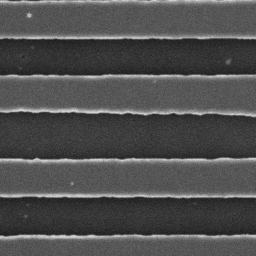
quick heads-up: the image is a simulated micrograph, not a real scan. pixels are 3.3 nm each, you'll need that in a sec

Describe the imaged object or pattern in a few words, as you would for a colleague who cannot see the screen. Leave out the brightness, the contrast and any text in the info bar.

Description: lines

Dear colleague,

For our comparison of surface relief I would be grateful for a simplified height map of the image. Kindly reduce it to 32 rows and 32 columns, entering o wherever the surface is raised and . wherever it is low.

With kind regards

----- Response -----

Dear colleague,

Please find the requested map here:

oooooooooooooooooooooooooooooooo
oooooooooooooooooooooooooooooooo
oooooooooooooooooooooooooooooooo
oooooooooooooooooooooooooooooooo
oooooooooooooooooooooooooooooooo
................................
................................
................................
................................
.oo.ooo.o....ooooooooooooo.ooooo
oooooooooooooooooooooooooooooooo
oooooooooooooooooooooooooooooooo
oooooooooooooooooooooooooooooooo
oooooooooooooooooooooooooooooooo
...............................o
................................
................................
................................
................................
................................
oooooooooooooooooooooooooooooooo
oooooooooooooooooooooooooooooooo
oooooooooooooooooooooooooooooooo
oooooooooooooooooooooooooooooooo
ooo.ooooooooo.ooo.oooooooooooooo
................................
................................
................................
................................
..oooooooo.o..oooo.ooooooo.ooooo
oooooooooooooooooooooooooooooooo
oooooooooooooooooooooooooooooooo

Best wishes